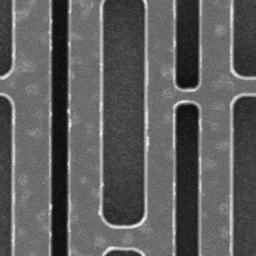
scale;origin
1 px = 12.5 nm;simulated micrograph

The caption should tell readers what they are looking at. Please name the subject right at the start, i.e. one or a few lines or trenches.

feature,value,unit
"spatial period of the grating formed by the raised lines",0.773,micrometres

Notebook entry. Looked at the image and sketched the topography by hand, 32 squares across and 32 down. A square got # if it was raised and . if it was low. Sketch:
..####...####.....####...####...
..####...####.....####...####...
..####...####.....####...####...
..####...####.....####...####...
..####...####.....####...####...
..####...####.....####...####...
..####...####.....####...####...
..####...####.....####...####...
.#####...####.....####...####...
.#####...####.....####...#####..
######...####.....####...#######
######...####.....##############
.#####...####.....###########...
..####..#####.....####...####...
..####...####.....####...####...
..####...####.....####...####...
..####...####.....####...####...
..####...####.....####...####...
..####...####.....####...####...
..####...####.....####...####...
..####...####.....####...####...
..####...####.....####...####...
..####...####.....####...####...
..####...####.....####...####...
..####...####.....####...####...
..####...####.....####...####...
..####...####.....####...####...
..####...####.....####...####...
..####..##############...####...
..####...#############...####...
..####...#############...####...
..####...####....#####...####...